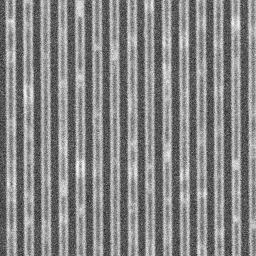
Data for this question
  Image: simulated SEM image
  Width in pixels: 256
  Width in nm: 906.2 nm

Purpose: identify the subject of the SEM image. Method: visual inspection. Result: parallel lines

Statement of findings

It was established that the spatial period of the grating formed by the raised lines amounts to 61.2 nm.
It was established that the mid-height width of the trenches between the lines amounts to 8.73 pixels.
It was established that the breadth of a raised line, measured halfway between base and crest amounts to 30.9 nanometers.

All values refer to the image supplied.